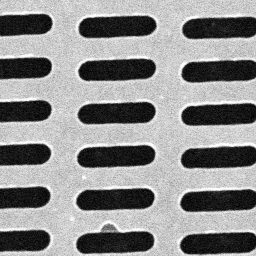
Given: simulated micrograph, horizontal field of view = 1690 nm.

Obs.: holes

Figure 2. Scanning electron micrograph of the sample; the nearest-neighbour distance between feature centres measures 284 nm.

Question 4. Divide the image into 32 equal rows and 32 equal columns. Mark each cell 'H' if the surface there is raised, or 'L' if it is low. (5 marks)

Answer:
HHHHHHHHHHHHHHHHHHHHHHHHHHHHHHHH
HHHHHHHHHHHHHHHHHHHHHHHHHHHHHHHH
LLLLLLLHHHLLLLLLLLLHHHHHLLLLLLLL
LLLLLLHHHHLLLLLLLLLLHHHLLLLLLLLL
LLHHHHHHHHLLLLLLLLHHHHHLLLLLLLLL
HHHHHHHHHHHHHHHHHHHHHHHHHHHHHHHH
HHHHHHHHHHHHHHHHHHHHHHHHHHHHHHHH
LLLLLLHHHHHHHLLLLLLHHHHHHHHHLLLH
LLLLLLHHHHLLLLLLLLLHHHHLLLLLLLLL
LLLLLLHHHHLLLLLLLLLHHHHLLLLLLLLL
HHHHHHHHHHHHHHHHHHHHHHHHHHHHHHHH
HHHHHHHHHHHHHHHHHHHHHHHHHHHHHHHH
HHHHHHHHHHHHHHHHHHHHHHHHHHHHHHHH
LLLLLLHHHHLLLLLLLLLHHHHLLLLLLLLL
LLLLLLHHHHLLLLLLLLLHHHHLLLLLLLLL
HHHHHHHHHHHLLLLLHHHHHHHLLLLLLLLH
HHHHHHHHHHHHHHHHHHHHHHHHHHHHHHHH
HHHHHHHHHHHHHHHHHHHHHHHHHHHHHHHH
LLLLLLHHHHHLLLLLLLLHHHHHLLLLLLLL
LLLLLLHHHHLLLLLLLLLHHHHLLLLLLLLL
LLLLLHHHHHLLLLLLLLLHHHHLLLLLLLLL
HHHHHHHHHHHHHHHHHHHHHHHHHHHHHHHH
HHHHHHHHHHHHHHHHHHHHHHHHHHHHHHHH
LLLLLLHHHHHHHHHLHHHHHHHHHHHHHHHH
LLLLLLHHHHLLLLLLLLLHHHHLLLLLLLLL
LLLLLLHHHHLLLLLLLLLHHHHLLLLLLLLL
HHHHHHHHHHHHHHHHHHHHHHHLLLHHHHHH
HHHHHHHHHHHHHHHHHHHHHHHHHHHHHHHH
HHHHHHHHHHHHHHHHHHHHHHHHHHHHHHHH
LLLLLLHHHHLLLLLLLLLHHHHLLLLLLLLL
LLLLLLHHHLLLLLLLLLLHHHLLLLLLLLLL
LLHHHHHHHHLLLLLLLHHHHHHLLLLLLLLH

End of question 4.